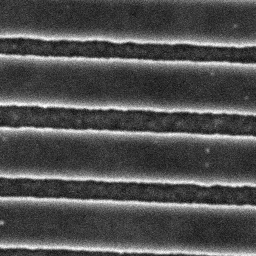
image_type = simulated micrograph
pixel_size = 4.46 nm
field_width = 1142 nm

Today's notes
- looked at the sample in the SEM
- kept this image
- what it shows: lines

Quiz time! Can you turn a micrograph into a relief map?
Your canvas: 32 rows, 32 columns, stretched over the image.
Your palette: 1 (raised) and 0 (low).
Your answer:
11111111111111111111111111111111
11111111111111111111111111111111
11111111111111111111111111111111
11111111111111111111111111111111
11111111111111111111111111111111
00000000000000000000000011111111
00000000000000000000000000000000
11111111111111111100000000000000
11111111111111111111111111111111
11111111111111111111111111111111
11111111111111111111111111111111
11111111111111111111111111111111
11111111111111111111111111111111
00000000011111111111111111111111
00000000000000000000000000000000
00000000000000000000000000000000
11111111111111110000000000000000
11111111111111111111111111111111
11111111111111111111111111111111
11111111111111111111111111111111
11111111111111111111111111111111
11111111111111111111111111111111
00000000001011111111111111111111
00000000000000000000000000000000
00000000000000000000000000000000
11111111111111111111111100000000
11111111111111111111111111111111
11111111111111111111111111111111
11111111111111111111111111111111
11111111111111111111111111111111
11111111111111111111111111111111
00000000000000011111111111111111